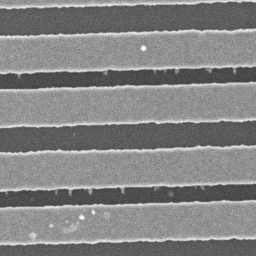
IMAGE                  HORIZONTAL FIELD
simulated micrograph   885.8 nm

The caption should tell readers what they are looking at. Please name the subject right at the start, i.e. lines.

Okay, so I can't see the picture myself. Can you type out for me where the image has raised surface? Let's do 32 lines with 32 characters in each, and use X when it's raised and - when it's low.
XXXXXXXXXXXXXXXXX-XX------------
--------------------------------
--------------------------------
--------------------------------
-----XXXXXXXXXXXXXXXXXXXXXXXXXXX
XXXXXXXXXXXXXXXXXXXXXXXXXXXXXXXX
XXXXXXXXXXXXXXXXXXXXXXXXXXXXXXXX
XXXXXXXXXXXXXXXXXXXXXXXXXXXXXXXX
XXXXXXXXXXXXXXXXXXXXXXX-X-------
--------------------------------
--------------------------X-XXXX
XXXXXXXXXXXXXXXXXXXXXXXXXXXXXXXX
XXXXXXXXXXXXXXXXXXXXXXXXXXXXXXXX
XXXXXXXXXXXXXXXXXXXXXXXXXXXXXXXX
XXXXXXXXXXXXXXXXXXXXXXXXXXXXXXXX
XXXXXXXXXXXXXXX-----------------
--------------------------------
--------------------------------
------------------------XXXXXXXX
XXXXXXXXXXXXXXXXXXXXXXXXXXXXXXXX
XXXXXXXXXXXXXXXXXXXXXXXXXXXXXXXX
XXXXXXXXXXXXXXXXXXXXXXXXXXXXXXXX
XXXXXXXXXXXXXXXXXXXXXXXXXXXXXXXX
XXXXXXXXXXXXX-------------------
--------------------------------
-----------------XXXXXXXXXXXXXXX
XXXXXXXXXXXXXXXXXXXXXXXXXXXXXXXX
XXXXXXXXXXXXXXXXXXXXXXXXXXXXXXXX
XXXXXXXXXXXXXXXXXXXXXXXXXXXXXXXX
XXXXXXXXXXXXXXXXXXXXXXXXXXXXXXXX
XXXX----------------------------
--------------------------------